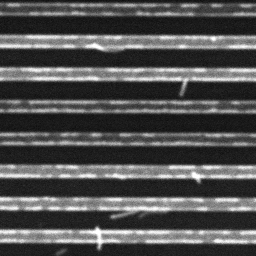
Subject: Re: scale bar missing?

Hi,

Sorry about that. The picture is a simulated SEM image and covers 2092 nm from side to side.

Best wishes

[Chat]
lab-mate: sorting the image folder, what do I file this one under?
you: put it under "parallel lines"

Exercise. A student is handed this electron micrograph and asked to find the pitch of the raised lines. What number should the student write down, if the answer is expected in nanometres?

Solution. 265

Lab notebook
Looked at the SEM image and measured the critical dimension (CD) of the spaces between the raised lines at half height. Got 21.5 pixels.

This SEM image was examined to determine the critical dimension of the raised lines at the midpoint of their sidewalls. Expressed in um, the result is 0.0909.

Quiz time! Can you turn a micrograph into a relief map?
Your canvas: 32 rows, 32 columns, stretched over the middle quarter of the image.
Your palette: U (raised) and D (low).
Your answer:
DDDDDDDDDDDDDDDDDDDDDDDDDDDDDDDD
UUUUUUUUUUUUUUUUUUUUUUUUUUUUUUUU
UUUUUUUUUUUUUUUUUUUUUUUUUUUUUUUU
UUUUUUUUUUUUUUUUUUUUUUUUUUUUUUUU
DDDDDDDDDDDDDDDDDDDDDDDDDDDDDDDD
DDDDDDDDDDDDDDDDDDDDDDDDDDDDDDDD
DDDDDDDDDDDDDDDDDDDDDDDDDDDDDDDD
DDDDDDDDDDDDDDDDDDDDDDDDDDDDDDDD
DDDDDDDDDDDDDDDDDDDDDDDDDDDDDDDD
UUUUUUUUUUUDDDDDDDDDDDDDDDDDDDDD
UUUUUUUUUUUUUUUUUUUUUUUUUUUUUUUU
UUUUUUUUUUUUUUUUUUUUUUUUUUUUUUUU
DDDDDDDDDDDDDDDDDDDDDDDDDDDDDDDD
DDDDDDDDDDDDDDDDDDDDDDDDDDDDDDDD
DDDDDDDDDDDDDDDDDDDDDDDDDDDDDDDD
DDDDDDDDDDDDDDDDDDDDDDDDDDDDDDDD
DDDDDDDDDDDDDDDDDDDDDDDDDDDDDDDD
UUUUUUUUUUUUUUUUUUUUUUUUUUUUDDDD
UUUUUUUUUUUUUUUUUUUUUUUUUUUUUUUU
UUUUUUUUUUUUUUUUUUUUUUUUUUUUUUUU
DDDDDDDDDDDDDDDDDDDDDDDDDDDDDDDD
DDDDDDDDDDDDDDDDDDDDDDDDDDDDDDDD
DDDDDDDDDDDDDDDDDDDDDDDDDDDDDDDD
DDDDDDDDDDDDDDDDDDDDDDDDDDDDDDDD
DDDDDDDDDDDDDDDDDDDDDDDDDDDDDDDD
DDDDDDDDDDDDDDDDDDDDDDDDDDDDDDDD
UUUUUUUUUUUUUUUUUUUUUUUUUUUUUUUU
UUUUUUUUUUUUUUUUUUUUUUUUUUUUUUUU
DDDDDDDDDDDDDDDDDDDDDDDDDDDDDDDD
DDDDDDDDDDDDDDDDDDDDDDDDDDDDDDDD
DDDDDDDDDDDDDDDDDDDDDDDDDDDDDDDD
DDDDDDDDDDDDDDDDDDDDDDDDDDDDDDDD